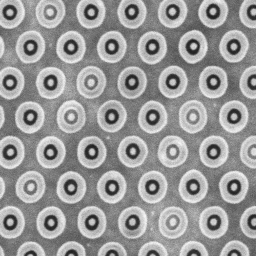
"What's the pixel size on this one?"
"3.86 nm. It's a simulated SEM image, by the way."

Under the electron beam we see a regular array of ring-shaped raised bodies with a dot in the middle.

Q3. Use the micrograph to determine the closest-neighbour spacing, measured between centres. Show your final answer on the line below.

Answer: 155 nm